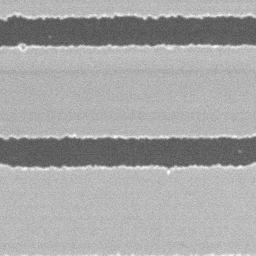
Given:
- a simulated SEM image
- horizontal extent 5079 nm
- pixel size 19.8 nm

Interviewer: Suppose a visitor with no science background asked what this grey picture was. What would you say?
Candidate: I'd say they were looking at one or a few lines or trenches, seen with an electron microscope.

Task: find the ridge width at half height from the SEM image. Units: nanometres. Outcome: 611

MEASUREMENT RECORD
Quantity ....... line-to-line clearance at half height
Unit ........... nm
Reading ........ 1790